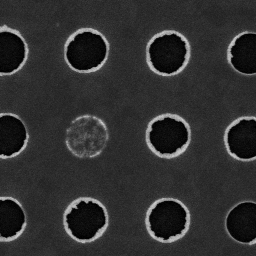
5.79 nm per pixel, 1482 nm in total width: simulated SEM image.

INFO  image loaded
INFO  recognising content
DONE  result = holes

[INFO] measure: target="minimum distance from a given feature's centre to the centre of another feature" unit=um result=0.473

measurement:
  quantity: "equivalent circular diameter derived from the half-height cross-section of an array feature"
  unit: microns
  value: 0.215